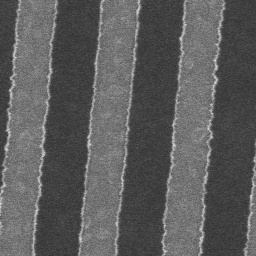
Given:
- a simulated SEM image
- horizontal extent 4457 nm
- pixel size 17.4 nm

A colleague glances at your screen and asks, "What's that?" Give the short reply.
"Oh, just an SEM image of one or a few lines or trenches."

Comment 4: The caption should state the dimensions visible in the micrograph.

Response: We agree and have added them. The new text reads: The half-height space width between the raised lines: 620 nanometres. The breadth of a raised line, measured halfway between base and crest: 0.83 micrometres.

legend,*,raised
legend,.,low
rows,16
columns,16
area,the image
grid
*..***...***..**
*..***...***..**
*..***..***...**
*..***..***...**
*..***..***..***
*..***..***..***
*..***..***..***
*..***..***..***
*..***..***..***
...***..***..***
...**...***..***
..***...***..***
..***...**...***
..***..***...***
..***..***...***
..***..***...**.